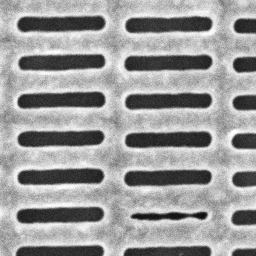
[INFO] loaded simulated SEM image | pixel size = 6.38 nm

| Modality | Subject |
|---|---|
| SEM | a regular array of holes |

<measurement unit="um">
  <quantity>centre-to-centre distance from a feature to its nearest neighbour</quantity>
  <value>0.243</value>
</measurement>